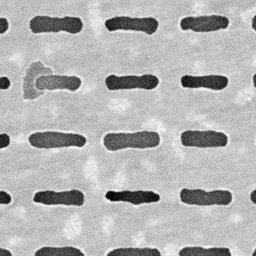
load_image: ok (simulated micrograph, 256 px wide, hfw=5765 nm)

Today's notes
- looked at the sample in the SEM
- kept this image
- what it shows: a regular array of holes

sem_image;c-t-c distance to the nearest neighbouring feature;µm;1.3